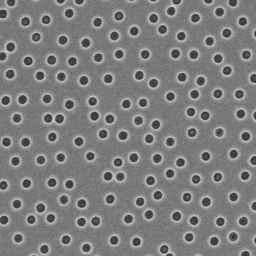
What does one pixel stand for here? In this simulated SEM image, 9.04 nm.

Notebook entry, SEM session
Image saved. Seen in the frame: a regular array of holes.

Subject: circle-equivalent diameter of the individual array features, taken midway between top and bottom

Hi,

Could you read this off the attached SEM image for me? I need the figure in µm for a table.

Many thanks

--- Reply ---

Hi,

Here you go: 0.0809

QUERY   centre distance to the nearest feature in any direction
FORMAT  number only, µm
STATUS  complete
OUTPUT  0.172